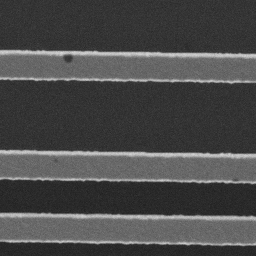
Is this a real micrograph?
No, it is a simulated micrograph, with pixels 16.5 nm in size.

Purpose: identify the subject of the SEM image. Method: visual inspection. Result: lines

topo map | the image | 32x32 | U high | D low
DDDDDDDDDDDDDDDDDDDDDDDDDDDDDDDD
DDDDDDDDDDDDDDDDDDDDDDDDDDDDDDDD
DDDDDDDDDDDDDDDDDDDDDDDDDDDDDDDD
DDDDDDDDDDDDDDDDDDDDDDDDDDDDDDDD
DDDDDDDDDDDDDDDDDDDDDDDDDDDDDDDD
DDDDDDDDDDDDDDDDDDDDDDDDDDDDDDDD
UUUUUUUUUUUUUDDDDDDDDDDDDDDDDDDD
UUUUUUUUUUUUUUUUUUUUUUUUUUUUUUUU
UUUUUUUUUUUUUUUUUUUUUUUUUUUUUUUU
UUUUUUUUUUUUUUUUUUUUUUUUUUUUUUUU
DDDDDDDDDDDDDDDDDDDDDDDDDDDDDDDD
DDDDDDDDDDDDDDDDDDDDDDDDDDDDDDDD
DDDDDDDDDDDDDDDDDDDDDDDDDDDDDDDD
DDDDDDDDDDDDDDDDDDDDDDDDDDDDDDDD
DDDDDDDDDDDDDDDDDDDDDDDDDDDDDDDD
DDDDDDDDDDDDDDDDDDDDDDDDDDDDDDDD
DDDDDDDDDDDDDDDDDDDDDDDDDDDDDDDD
DDDDDDDDDDDDDDDDDDDDDDDDDDDDDDDD
DDDDDDDDDDDDDDDDDDDDDDDDDDDDDDDD
UUUUUUUUUUUUUUUUUUUUUUUUUUUUUUUU
UUUUUUUUUUUUUUUUUUUUUUUUUUUUUUUU
UUUUUUUUUUUUUUUUUUUUUUUUUUUUUUUU
DDDDDUUUUUUUUUUUUUUUUUUUUUUUUUUU
DDDDDDDDDDDDDDDDDDDDDDDDDDDDDDDD
DDDDDDDDDDDDDDDDDDDDDDDDDDDDDDDD
DDDDDDDDDDDDDDDDDDDDDDDDDDDDDDDD
DDDDDDDDDDDDDDDDDDDDDDDDDDDDDDDD
UUUUUUUUUUUUUUUUUUUUUUUUUUUUUUUU
UUUUUUUUUUUUUUUUUUUUUUUUUUUUUUUU
UUUUUUUUUUUUUUUUUUUUUUUUUUUUUUUU
DDDDDDDDDDDDDDDDDDDDDDDUDUUUUUUU
DDDDDDDDDDDDDDDDDDDDDDDDDDDDDDDD